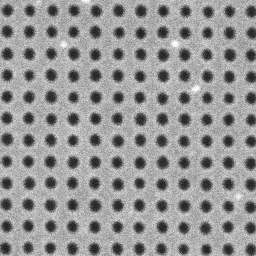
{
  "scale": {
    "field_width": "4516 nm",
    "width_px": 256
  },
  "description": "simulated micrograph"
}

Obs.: a regular array of holes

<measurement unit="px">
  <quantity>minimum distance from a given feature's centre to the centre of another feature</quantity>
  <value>21.3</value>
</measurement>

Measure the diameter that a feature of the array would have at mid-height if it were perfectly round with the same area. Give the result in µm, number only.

0.232